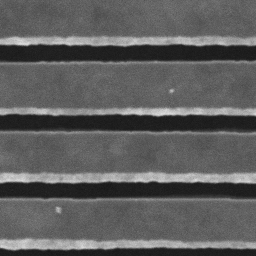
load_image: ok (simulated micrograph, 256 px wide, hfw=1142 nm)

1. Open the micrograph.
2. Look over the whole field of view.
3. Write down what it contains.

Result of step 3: lines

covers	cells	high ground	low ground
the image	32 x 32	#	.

################################
################################
################################
################################
################################
######################.#########
................................
................................
################################
################################
################################
################################
################################
################################
................................
................................
###################.####...##...
################################
################################
################################
################################
################################
################################
................................
................................
################################
################################
################################
################################
################################
################################
................................